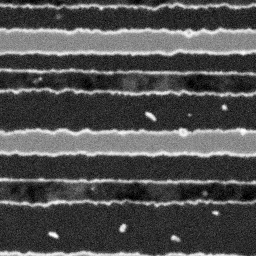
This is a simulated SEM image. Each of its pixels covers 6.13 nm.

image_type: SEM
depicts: lines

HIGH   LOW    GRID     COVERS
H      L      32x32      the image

HHHHHHHHHHHHHHHHHHHHHHHHHHHHHHHH
LLLLLLLLLLLLLLLLLLLLLLLLLLLLLLLL
LLLLLLLLLLLLLLLLLLLLLLLLLLLLLLLL
LLLLLLLLLLLLLLLLLLLLLLLLLLLLLLLL
HHHHHHHHHHHHHHHHHHHHHHHHHHHHHHHH
HHHHHHHHHHHHHHHHHHHHHHHHHHHHHHHH
HHHHHHHHHHHHHHHHHHHHHHLHHHHHHHHH
LLLLLLLLLLLLLLLLLLLLLLLLLLLLLLLL
LLLLLLLLLLLLLLLLLLLLLLLLLLLLLLLL
HHHHHHHHHHHHHHHHHHHHHHHHHHHHHHHH
HHHHHHHHHHHHHHHHHHHHHHHHHHHHHHHH
LLLLLLLHLLHHLHHHHHHHHHHHHHHHHHHH
LLLLLLLLLLLLLLLLLLLLLLLLLLLLLLLL
LLLLLLLLLLLLLLLLLLLLLLLLLLLLLLLL
LLLLLLLLLLLLLLLLLLLLLLLLLLLLLLLL
LLLLLLLLLLLLLLLLLLLLLLLLLLLLLLLL
LLHHHHLHHLHHLHHHHHHLHHHHHHHHHHHH
HHHHHHHHHHHHHHHHHHHHHHHHHHHHHHHH
HHHHHHHHHHHHHHHHHHHHHHHHHHHHHHHH
LLLLLLLLLLLLLLLLLLLLLLLLLLLLLLLL
LLLLLLLLLLLLLLLLLLLLLLLLLLLLLLLL
LLLLLLLLLLLLLLLLLLLLLLLLLLLLLLLL
HHHLHLLLLLLLLLLLLLLLLLLLLLLLLLLL
HHHHHHHHHHHHHHHHHHHHHHHHHHHHHHHH
HHHHHHHHHHHHHHHHHHHHHHHHHHHHHHHH
LLHHHHLLLLLLLLLLLLHHHLHLLLLLLLLL
LLLLLLLLLLLLLLLLLLLLLLLLLLLLLLLL
LLLLLLLLLLLLLLLLLLLLLLLLLLLLLLLL
LLLLLLLLLLLLLLLLLLLLLLLLLLLLLLLL
LLLLLLLLLLLLLLLLLLLLLLLLLLLLLLLL
LLLLLLLLLLLLLLLLLLLLLLLLLLLLLLLL
LLLLLLLLLLLLLLLLLLLLLLLLLLLLLLLL